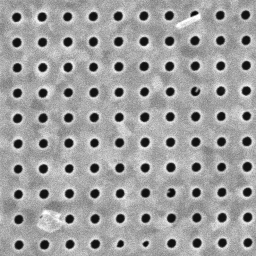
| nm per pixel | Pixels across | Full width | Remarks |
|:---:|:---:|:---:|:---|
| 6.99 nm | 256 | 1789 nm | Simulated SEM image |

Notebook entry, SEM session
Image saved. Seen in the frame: a regular array of holes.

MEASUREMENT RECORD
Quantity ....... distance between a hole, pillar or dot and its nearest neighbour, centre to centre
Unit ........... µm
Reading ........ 0.176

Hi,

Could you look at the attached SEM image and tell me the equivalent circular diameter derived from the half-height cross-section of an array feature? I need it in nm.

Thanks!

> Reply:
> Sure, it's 65.1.